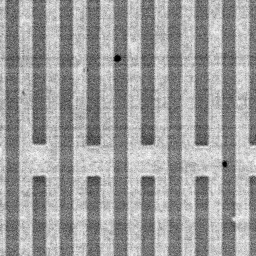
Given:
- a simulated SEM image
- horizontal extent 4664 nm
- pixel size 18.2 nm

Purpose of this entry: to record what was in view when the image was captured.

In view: parallel lines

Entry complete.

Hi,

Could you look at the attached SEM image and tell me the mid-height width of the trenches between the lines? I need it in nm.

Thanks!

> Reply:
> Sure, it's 280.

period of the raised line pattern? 493 nanometres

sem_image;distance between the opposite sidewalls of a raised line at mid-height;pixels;11.8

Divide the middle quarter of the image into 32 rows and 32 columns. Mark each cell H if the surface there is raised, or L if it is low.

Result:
LLLHHLLLLHHHLLLLHHHLLLLHHHLLLLHH
LLLHHLLLLHHHLLLLHHHLLLLHHHLLLLHH
LLLHHLLLLHHHLLLLHHHLLLLHHHLLLLHH
LLLHHLLLLHHHLLLLHHHLLLLHHHLLLLHH
LLLHHLLLLHHHLLLLHHHLLLLHHHLLLLHH
LLLHHLLLLHHHLLLLHHHLLLLHHHLLLLHH
LLLHHLLLLHHHLLLLHHHLLLLHHHLLLLHH
LLLHHLLLLHHHLLLLHHHLLLLHHHLLLLHH
LLLHHLLLLHHHLLLLHHHLLLLHHHLLLLHH
LLLHHLLLLHHHLLLLHHHLLLLHHHLLLLHH
LLLHHLLLLHHHLLLLHHHLLLLHHHLLLLHH
LLLHHLLLLHHHLLLLHHHLLLLHHHLLLLHH
LLLHHLLLLHHHLLLLHHHLLLLHHHLLLLHH
LLLHHLLLLHHHLLLLHHHLLLLHHHLLLLHH
LLLHHLLLLHHHLLLLHHHLLLLHHHLLLLHH
LLLHHLLLLHHHLLLLHHHLLLLHHHLLLLHH
LLLHHLLLLHHHLLLLHHHLLLLHHHLLLLHH
LLLHHLLLLHHHLLLLHHHLLLLHHHLLLLHH
LLLHHLLLLHHHLLLLHHHLLLLHHHLLLLHH
LLLHHLLLLHHHLLLLHHHLLLLHHHLLLLHH
LLLHHHLLHHHHLLLLHHHHLHHHHHLLLLHH
LLLHHHHHHHHHLLLLHHHHHHHHHHLLLLHH
LLLHHHHHHHHHLLLLHHHHHHHHHHLLLLHH
LLLHHHHHHHHHLLLLHHHHHHHHHHLLLLHH
LLLHHHHHHHHHLLLLHHHHHHHHHHLLLLHH
LLLHHHHHHHHHLLLLHHHHHHHHHHLLLLHH
LLLHHHHHHHHHLLLLHHHHHHHHHHLLLLHH
LLLHHHHHHHHHLLLLHHHHHHHHHHLLLLHH
LLLHHLLLLHHHLLLLHHHLLLLHHHLLLLHH
LLLHHLLLLHHHLLLLHHHLLLLHHHLLLLHH
LLLHHLLLLHHHLLLLHHHLLLLHHHLLLLHH
LLLHHLLLLHHHLLLLHHHLLLLHHHLLLLHH